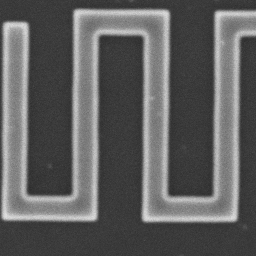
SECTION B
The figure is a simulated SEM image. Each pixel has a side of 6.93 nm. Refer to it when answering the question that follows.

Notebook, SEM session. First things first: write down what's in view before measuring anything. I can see groups of lines, slits or small figures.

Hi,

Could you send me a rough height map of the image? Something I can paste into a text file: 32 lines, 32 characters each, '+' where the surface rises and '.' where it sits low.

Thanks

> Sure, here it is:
................................
..........++....................
.........++++++++++++......+++++
.++......++++++++++++......+++++
.++......+++......+++......+++..
.++......+++......+++......+++..
.++......+++......+++......+++..
.++......+++......+++......+++..
.++......+++......+++......+++..
.++......+++......+++......+++..
.++......+++......+++......+++..
.++......+++......+++......+++..
.++......+++......+++......+++..
.++......+++......+++......+++..
.++......+++......+++......+++..
.++......+++......+++......+++..
.++......+++......+++......+++..
.++......+++......+++......+++..
.++......+++......+++......+++..
.++......+++......+++......+++..
.++......+++......+++......+++..
.++......+++......+++......+++..
.++......+++......+++......+++..
.++......+++......+++......+++..
+++......+++......+++......+++..
++++++++++++......+++++++++++...
++++++++++++......+++++++++++...
................................
................................
................................
................................
................................